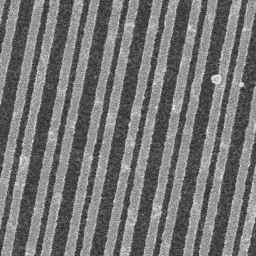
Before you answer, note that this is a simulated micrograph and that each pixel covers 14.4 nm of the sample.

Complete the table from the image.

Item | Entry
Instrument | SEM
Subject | parallel lines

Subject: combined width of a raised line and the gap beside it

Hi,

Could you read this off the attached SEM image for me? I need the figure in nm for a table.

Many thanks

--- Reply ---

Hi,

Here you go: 278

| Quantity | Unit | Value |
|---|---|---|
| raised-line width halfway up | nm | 125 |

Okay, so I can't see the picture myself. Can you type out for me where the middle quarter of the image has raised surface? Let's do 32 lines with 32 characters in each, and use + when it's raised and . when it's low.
++.+++...+++.++....++..++....++.
+..++....++..++....++..++....++.
+..++....++..++....++..++....++.
+..++....++..++....++..++...++..
+..++....++..++....++.+++...+++.
+.+++...++..+++...++..++....++..
+.+++...++..++....++..++....++..
..++....++..++....++..++....++..
..++....++..++....++..++...+++..
..++....++..++....++..++...++..+
..++....++.+++...++..++....++..+
.++....+++.++....++..++....++..+
.++....++..++....++..++....++..+
.++....++..++....++..++....++..+
.++....++..++....++..++...+++.++
+++....++.+++...+++.++....++..++
++....++..++....++..++....++..++
++....++..++....++..++....++..++
++....++..++....++..++....++..++
++....++..++....++.+++...++..+++
++...++...++...++..++....++..++.
++...++..++....++..++....++..++.
+....++..++....++..++....++..++.
+....++..++....++..++....++..++.
+....++..++...+++.++....+++.+++.
+...+++..++...++..++....++..++..
+...++..++....++..++....++..++..
....++..++....++..++....++..++..
....++..++....++..++....++..++..
....++..++....++..++....++..++..
...+++..++...+++.+++...++..++...
...++..++....++..++....++..++...